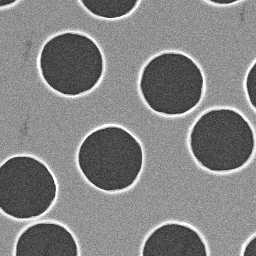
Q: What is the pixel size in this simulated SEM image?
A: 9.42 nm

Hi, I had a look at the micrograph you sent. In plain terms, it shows holes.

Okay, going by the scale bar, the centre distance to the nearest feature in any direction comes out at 813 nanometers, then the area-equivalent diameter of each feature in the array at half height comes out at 598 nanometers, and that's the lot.